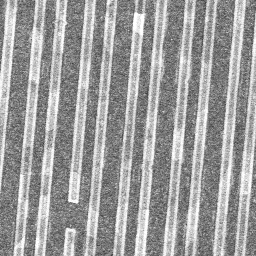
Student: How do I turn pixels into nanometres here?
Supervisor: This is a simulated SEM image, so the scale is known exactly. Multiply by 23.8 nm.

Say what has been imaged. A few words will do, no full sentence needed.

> parallel lines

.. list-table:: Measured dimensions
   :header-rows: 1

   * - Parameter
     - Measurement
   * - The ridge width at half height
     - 190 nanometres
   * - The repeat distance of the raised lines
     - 0.592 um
